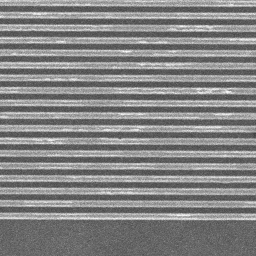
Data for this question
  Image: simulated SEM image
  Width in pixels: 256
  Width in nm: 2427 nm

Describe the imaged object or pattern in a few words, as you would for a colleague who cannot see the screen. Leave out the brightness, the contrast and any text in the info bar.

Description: parallel lines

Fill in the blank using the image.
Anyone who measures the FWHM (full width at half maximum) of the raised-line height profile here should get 53.3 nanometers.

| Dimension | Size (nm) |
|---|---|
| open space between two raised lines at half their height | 61.6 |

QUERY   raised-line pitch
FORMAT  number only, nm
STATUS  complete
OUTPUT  119